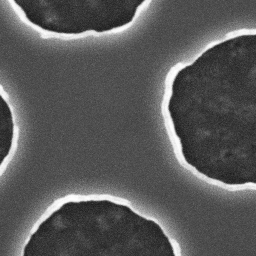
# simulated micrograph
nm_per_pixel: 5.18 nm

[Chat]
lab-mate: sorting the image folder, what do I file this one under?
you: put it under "holes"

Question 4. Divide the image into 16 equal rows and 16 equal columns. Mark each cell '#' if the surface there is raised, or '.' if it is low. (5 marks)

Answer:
#........#######
##......########
##############..
############....
###########.....
###########.....
###########.....
.##########.....
.##########.....
.##########.....
############....
##############.#
################
###......#######
##........######
##.........#####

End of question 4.